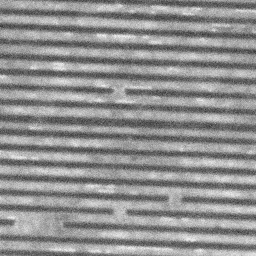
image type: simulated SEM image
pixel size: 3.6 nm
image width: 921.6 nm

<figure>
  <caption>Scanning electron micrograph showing parallel lines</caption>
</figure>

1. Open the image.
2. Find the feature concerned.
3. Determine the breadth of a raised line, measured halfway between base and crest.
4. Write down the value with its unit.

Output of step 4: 9.11 pixels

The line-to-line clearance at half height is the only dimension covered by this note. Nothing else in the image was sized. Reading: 22 nanometres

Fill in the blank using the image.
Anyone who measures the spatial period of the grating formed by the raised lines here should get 54.3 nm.